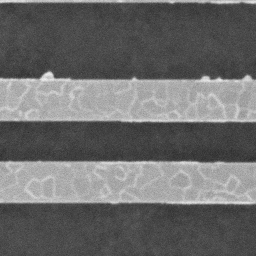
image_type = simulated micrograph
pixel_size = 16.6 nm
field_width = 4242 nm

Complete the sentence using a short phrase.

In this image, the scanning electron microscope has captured lines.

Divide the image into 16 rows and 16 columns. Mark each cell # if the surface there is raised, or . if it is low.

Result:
................
................
................
................
................
################
################
################
................
................
################
################
################
................
................
................